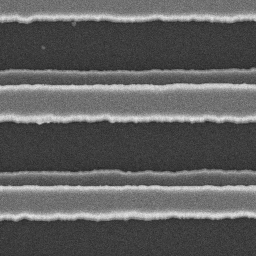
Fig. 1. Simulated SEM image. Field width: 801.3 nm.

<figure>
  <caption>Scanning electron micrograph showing lines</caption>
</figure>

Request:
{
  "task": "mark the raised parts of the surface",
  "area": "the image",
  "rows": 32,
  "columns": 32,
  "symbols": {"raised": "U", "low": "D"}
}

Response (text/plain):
UUUUUUUUUUUUUUUUUUUUUUUUUUUUUUUU
UUUUUUUUUUUUUUUUUUUUUUUUUUUUUUUU
UUUUDDDDDDDDDDUUUUUDDUDDDDUUUUDD
DDDDDDDDDDDDDDDDDDDDDDDDDDDDDDDD
DDDDDDDDDDDDDDDDDDDDDDDDDDDDDDDD
DDDDDDDDDDDDDDDDDDDDDDDDDDDDDDDD
DDDDDDDDDDDDDDDDDDDDDDDDDDDDDDDD
DDDDDDDDDDDDDDDDDDDDDDDDDDDDDDDD
DDDDDDDDDDDDDDDDDDDDDDDDDDDDDDDD
UUUUUUUUUUUUUUUUUUUUUUUUUUUUUUUU
UUUUUUUUUUUUUUUUUUUUUUUUUUUUUUUU
UUUUUUUUUUUUUUUUUUUUUUUUUUUUUUUU
UUUUUUUUUUUUUUUUUUUUUUUUUUUUUUUU
UUUUUUUUUUUUUUUUUUUUUUUUUUUUUUUU
UUUUUUUUUUUUUUUUUUUUUUUUUUUUUUUU
DDDDDDDDDDDDDDDDDDDDDDDDDDDDDDDD
DDDDDDDDDDDDDDDDDDDDDDDDDDDDDDDD
DDDDDDDDDDDDDDDDDDDDDDDDDDDDDDDD
DDDDDDDDDDDDDDDDDDDDDDDDDDDDDDDD
DDDDDDDDDDDDDDDDDDDDDDDDDDDDDDDD
DDDDDDDDDDDDDDDDDDDDDDDDDDDDDDDD
DDDDDDDDDDDDUUUDDDDDDDDDUUUUDDDD
UUUUUUUUUUUUUUUUUUUUUUUUUUUUUUUU
UUUUUUUUUUUUUUUUUUUUUUUUUUUUUUUU
UUUUUUUUUUUUUUUUUUUUUUUUUUUUUUUU
UUUUUUUUUUUUUUUUUUUUUUUUUUUUUUUU
UUUUUUUUUUUUUUUUUUUUUUUUUUUUUUUU
DDDDDDDDDDDDDDDDDDDDDDDDDDDDDDDD
DDDDDDDDDDDDDDDDDDDDDDDDDDDDDDDD
DDDDDDDDDDDDDDDDDDDDDDDDDDDDDDDD
DDDDDDDDDDDDDDDDDDDDDDDDDDDDDDDD
DDDDDDDDDDDDDDDDDDDDDDDDDDDDDDDD